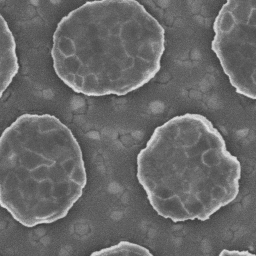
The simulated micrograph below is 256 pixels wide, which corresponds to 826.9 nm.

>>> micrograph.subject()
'raised bodies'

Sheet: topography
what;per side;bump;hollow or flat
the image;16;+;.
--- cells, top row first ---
.....++++.....++
....++++++...+++
+..+++++++...+++
+..+++++++....++
+...++++++....++
.....++++......+
................
.+++.......++...
+++++.....++++..
+++++....+++++..
+++++....++++++.
+++++....++++++.
+++++....+++++..
.+++......+++...
................
.......++.......